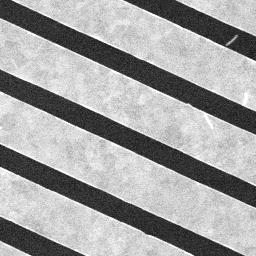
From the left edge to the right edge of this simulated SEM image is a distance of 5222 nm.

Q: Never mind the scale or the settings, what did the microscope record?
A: one or a few lines or trenches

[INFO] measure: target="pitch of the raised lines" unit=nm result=1380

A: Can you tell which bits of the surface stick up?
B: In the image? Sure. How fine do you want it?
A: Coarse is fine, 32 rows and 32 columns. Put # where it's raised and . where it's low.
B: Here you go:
...#############.......#########
.....#############.......#######
.......##############......#####
###......##############.......##
#####......##############.......
#######.......#############.....
#########.......#############...
###########.......#############.
#############.......############
..##############......##########
....##############.......#######
.......#############.......#####
##.......#############.......###
####.......#############.......#
#######......#############......
#########......##############...
###########......##############.
#############.......############
.##############.......##########
...###############......########
......##############......######
#.......##############......####
###.......##############......##
#####.......##############......
########......##############....
##########.......##############.
############.......#############
.#############.......###########
...##############......#########
.....##############......#######
#.......#############.......####
###.......#############.......##